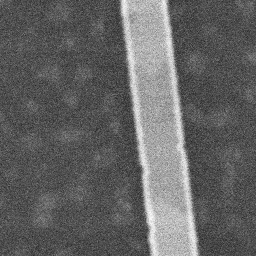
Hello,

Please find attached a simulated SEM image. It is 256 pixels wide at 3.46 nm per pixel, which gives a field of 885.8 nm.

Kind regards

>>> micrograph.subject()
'one or a few lines or trenches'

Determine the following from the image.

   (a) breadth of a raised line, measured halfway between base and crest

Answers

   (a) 138 nm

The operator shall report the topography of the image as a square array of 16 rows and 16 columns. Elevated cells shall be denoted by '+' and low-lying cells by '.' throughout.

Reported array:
........++......
........++......
........+++.....
........+++.....
........+++.....
........+++.....
........+++.....
.........++.....
.........++.....
.........++.....
.........+++....
.........+++....
.........+++....
.........+++....
..........++....
..........++....